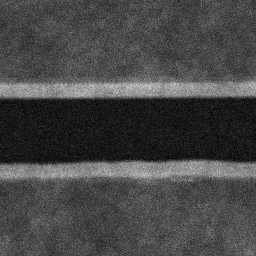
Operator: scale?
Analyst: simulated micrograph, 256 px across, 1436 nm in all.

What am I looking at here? one or a few lines or trenches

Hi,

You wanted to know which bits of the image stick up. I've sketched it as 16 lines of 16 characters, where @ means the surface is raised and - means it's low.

@@@@@@@@@@@@@@@@
@@@@@@@@@@@@@@@@
@@@@@@@@@@@@@@@@
@@@@@@@@@@@@@@@@
@@@@@@@@@@@@@@@@
@@@@@@@@@@@@@@@@
----------------
----------------
----------------
----------------
------------@---
@@@@@@@@@@@@@@@@
@@@@@@@@@@@@@@@@
@@@@@@@@@@@@@@@@
@@@@@@@@@@@@@@@@
@@@@@@@@@@@@@@@@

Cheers